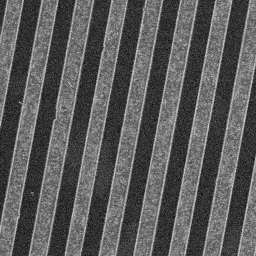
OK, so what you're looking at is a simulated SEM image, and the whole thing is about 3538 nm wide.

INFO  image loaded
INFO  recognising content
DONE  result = parallel lines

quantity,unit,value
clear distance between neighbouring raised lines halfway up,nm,250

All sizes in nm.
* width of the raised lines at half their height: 224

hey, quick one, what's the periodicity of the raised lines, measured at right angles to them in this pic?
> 0.472 um